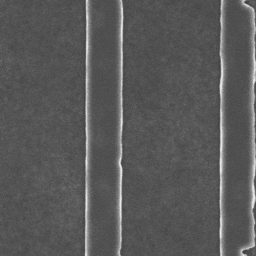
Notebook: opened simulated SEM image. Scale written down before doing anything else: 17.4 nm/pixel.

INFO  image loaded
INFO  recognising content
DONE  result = one or a few lines or trenches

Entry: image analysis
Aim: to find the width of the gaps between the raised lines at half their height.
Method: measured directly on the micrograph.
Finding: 1730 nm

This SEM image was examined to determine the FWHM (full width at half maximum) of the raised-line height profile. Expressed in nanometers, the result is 600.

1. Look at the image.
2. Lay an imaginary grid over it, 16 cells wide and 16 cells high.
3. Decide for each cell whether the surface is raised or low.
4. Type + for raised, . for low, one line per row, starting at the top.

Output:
.....+++......++
.....+++......++
.....+++......++
.....+++......++
.....+++......++
.....+++......++
.....+++......++
.....+++......++
.....+++......++
.....+++......++
.....+++......++
.....+++......++
.....+++......++
.....+++......++
.....+++......++
.....+++......++